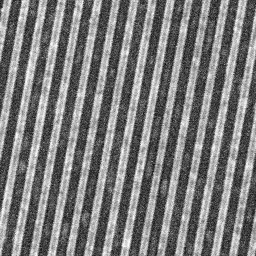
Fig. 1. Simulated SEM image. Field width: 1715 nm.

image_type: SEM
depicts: parallel lines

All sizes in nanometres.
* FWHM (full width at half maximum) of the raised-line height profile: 45.3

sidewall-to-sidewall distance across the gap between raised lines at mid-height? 78.2 nanometers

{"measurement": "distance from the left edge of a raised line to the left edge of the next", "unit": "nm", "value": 119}